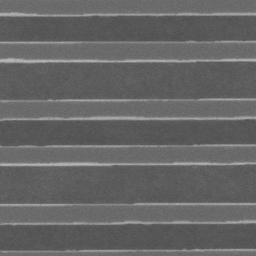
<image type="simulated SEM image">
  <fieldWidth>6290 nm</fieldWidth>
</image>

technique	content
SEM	lines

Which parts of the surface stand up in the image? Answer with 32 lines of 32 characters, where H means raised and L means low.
HHHHHHHHHHHHHHHHHHHHHHHHHHHHHHHH
HHHHHHHHHHHHHHHHHHHHHHHHHHHHHHHH
LLLLLLLLLLLLLLLLLLLLLLLLLLLLLLLL
LLLLLLLLLLLLLLLLLLLLLLLLLLLLLLLL
LLLLLLLLLLLLLLLLLLLLLLLLLLLLLLLL
HHHHHHHHHHHHHHHHHHHHHHHHHHHHHHHH
HHHHHHHHHHHHHHHHHHHHHHHHHHHHHHHH
HHHHHHHHHHHHHHHHHHHHHHHHHHHHLLLL
LLLLLLLLLLLLLLLLLLLLLLLLLLLLLLLL
LLLLLLLLLLLLLLLLLLLLLLLLLLLLLLLL
LLLLLLLLLLLLLLLLLLLLLLLLLLLLLLLL
LLLLLLLLLLLLLLLLLLLLLLLLLLLLLLLL
LLLLLLLLLLLLLLLLLLLLLLLLLLHHHHHH
HHHHHHHHHHHHHHHHHHHHHHHHHHHHHHHH
HHHHHHHHHHHHHHHHHHHHHHHHHHHHHHHH
LLLLLLLLLLLLLLLLLLLLLLLLLLLLLLLL
LLLLLLLLLLLLLLLLLLLLLLLLLLLLLLLL
LLLLLLLLLLLLLLLLLLLLLLLLLLLLLLLL
HHHHHHHHHHHHHHHHHHHHHHHHHHHHHHHH
HHHHHHHHHHHHHHHHHHHHHHHHHHHHHHHH
HHHHHHHHHHHHHHHHHHHHLLLLLLLLLLLL
LLLLLLLLLLLLLLLLLLLLLLLLLLLLLLLL
LLLLLLLLLLLLLLLLLLLLLLLLLLLLLLLL
LLLLLLLLLLLLLLLLLLLLLLLLLLLLLLLL
LLLLLLLLLLLLLLLLLLLLLLLLLLLLLLLL
LLLLLLLLLLLLLLLLLHHHHHHHHHHHHHHH
HHHHHHHHHHHHHHHHHHHHHHHHHHHHHHHH
HHHHHHHHHHHHHHHHHHHHHHHHHHHHHHHH
LLLLLLLLLLLLLLLLLLLLLLLLLLLLLLLL
LLLLLLLLLLLLLLLLLLLLLLLLLLLLLLLL
LLLLLLLLLLLLLLLLLLLLLLLLLLLLLLLL
HHHHHHHHHHHHHHHHHHHHHHHHHHHHHHHH